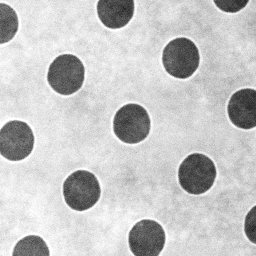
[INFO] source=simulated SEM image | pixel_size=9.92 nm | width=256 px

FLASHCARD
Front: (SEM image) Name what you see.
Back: holes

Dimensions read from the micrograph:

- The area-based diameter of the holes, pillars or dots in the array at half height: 399 nanometres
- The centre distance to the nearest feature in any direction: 815 nm